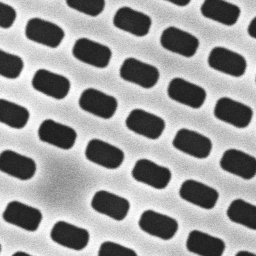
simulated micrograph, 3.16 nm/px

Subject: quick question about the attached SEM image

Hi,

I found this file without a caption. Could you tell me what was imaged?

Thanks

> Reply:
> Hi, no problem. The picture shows a regular array of holes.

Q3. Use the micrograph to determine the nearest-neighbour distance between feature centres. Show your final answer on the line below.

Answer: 50.9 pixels